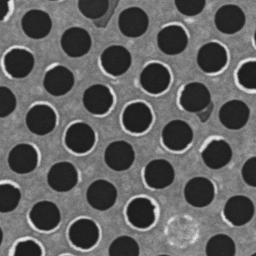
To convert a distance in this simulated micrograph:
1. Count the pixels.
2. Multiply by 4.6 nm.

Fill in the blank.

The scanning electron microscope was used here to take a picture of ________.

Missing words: a regular array of holes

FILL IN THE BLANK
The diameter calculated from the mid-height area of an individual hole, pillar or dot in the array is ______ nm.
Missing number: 142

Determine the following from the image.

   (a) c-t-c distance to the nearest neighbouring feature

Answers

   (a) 195 nanometers